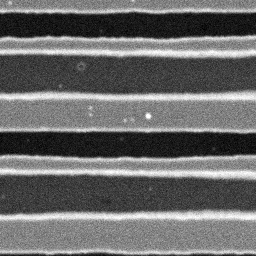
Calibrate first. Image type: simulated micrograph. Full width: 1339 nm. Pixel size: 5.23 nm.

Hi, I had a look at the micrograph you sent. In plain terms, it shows lines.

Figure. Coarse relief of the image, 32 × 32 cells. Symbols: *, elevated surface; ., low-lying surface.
********************************
*..************...***.......*...
................................
................................
................................
********************************
***.****************************
................................
................................
................................
................................
................................
********************************
********************************
********************************
********************************
.............................***
................................
................................
................................
********************************
..********..********************
................................
................................
................................
................................
................................
********************************
********************************
********************************
********************************
***********..*******************